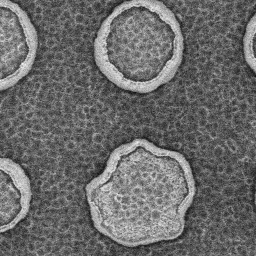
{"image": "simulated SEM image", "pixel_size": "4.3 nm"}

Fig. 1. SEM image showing raised bodies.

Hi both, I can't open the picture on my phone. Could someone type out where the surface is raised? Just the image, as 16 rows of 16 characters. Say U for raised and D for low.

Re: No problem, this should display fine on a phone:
UDDDDDDUUUDDDDDD
UUDDDDDUUUUDDDDD
UUDDDDUUUUUDDDDU
UUDDDDUUUUUDDDDU
UUDDDDDUUUUDDDDD
DDDDDDDDUUDDDDDD
DDDDDDDDDDDDDDDD
DDDDDDDDDDDDDDDD
DDDDDDDDDDDDDDDD
DDDDDDDUUUUDDDDD
UDDDDDDUUUUUDDDD
UUDDDDUUUUUUDDDD
UUDDDDUUUUUUDDDD
UDDDDDUUUUUDDDDD
DDDDDDUUUUUDDDDD
DDDDDDDDDDDDDDDD